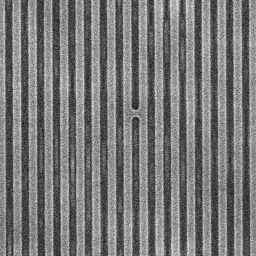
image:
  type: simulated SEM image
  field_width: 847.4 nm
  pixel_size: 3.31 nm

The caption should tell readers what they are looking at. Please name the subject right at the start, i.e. parallel lines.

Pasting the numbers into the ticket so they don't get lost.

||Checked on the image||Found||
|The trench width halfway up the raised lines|26.1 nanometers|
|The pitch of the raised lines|52.3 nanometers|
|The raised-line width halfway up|0.0261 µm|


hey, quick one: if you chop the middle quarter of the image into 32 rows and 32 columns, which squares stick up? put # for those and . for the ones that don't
#..##..##..##..##..##..##..#...#
#..##..##..##..##..##..##..#...#
#..##..##..##..##..##..##..##..#
#..##..##..##..##..##..##..##..#
#..##..##..##..##..##..##..##..#
#..##..##..##..##..##..##..##..#
#..##..##..##..##..##..##..##..#
#..##..##..##..##..##..##..##..#
#..##..##..##..##..##..##..##..#
#..##..##..##..##..##..##..##..#
#..##..##..##..##..##..##..##..#
#..##..##..##..##.###..##..##..#
#..##..##..##..######..##..##..#
#..##..##..##..##..##..##..##..#
#..##..##..##..##..##..##..##..#
#..##..##..##..##..##..##..##..#
#..##..##..##..##..##..##..##..#
#..##..##..##..##..##..##..##..#
#..##..##..##..##..##..##..##..#
#..##..##..##..##..##..##..##..#
#..##..##..##..##..##..##..##..#
#..##..##..##..##..##..##..##..#
#..##..##..##..##..##..##..##..#
#..##..##..##..##..##..##..##..#
#..##..##..##..##..##..##..##..#
#..##..##..##..##..##..##..##..#
#..##..##..##..##..##..##..##..#
#..##..##..##..##..##..##..##..#
#..##..##..##..##..##..##..##..#
#..##..##..##..##..##..##..##..#
#..##..##..##..##..##..##..##..#
#..##..##..##..##..##..##..##..#